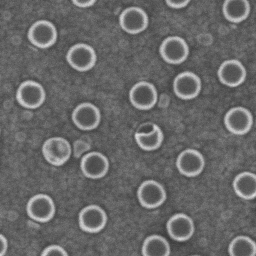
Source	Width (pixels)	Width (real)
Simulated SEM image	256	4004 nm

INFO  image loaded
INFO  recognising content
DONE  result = a regular array of raised bodies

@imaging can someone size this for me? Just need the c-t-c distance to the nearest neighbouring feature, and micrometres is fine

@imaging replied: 0.705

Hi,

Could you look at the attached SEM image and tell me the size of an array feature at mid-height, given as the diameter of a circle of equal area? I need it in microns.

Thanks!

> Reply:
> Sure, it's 0.401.